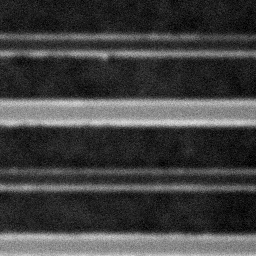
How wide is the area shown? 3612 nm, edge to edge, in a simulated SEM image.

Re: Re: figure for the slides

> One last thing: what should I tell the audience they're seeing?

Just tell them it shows lines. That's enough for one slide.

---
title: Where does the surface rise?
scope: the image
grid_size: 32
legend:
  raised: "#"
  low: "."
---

................................
................................
................................
................................
................................
################################
################################
................................
................................
................................
................................
................................
................................
################################
################################
..............................##
................................
................................
................................
................................
................................
################################
################################
################################
................................
................................
................................
................................
................................
#########.##########............
################################
################################